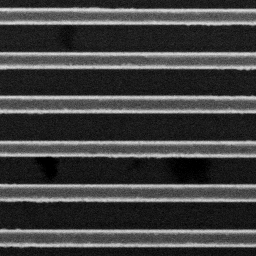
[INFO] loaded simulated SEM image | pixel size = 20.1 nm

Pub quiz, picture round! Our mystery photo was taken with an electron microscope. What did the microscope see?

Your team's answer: lines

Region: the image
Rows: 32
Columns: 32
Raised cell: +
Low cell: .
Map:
................................
++++++++++++++++++++++++++++++++
++++++++++++++++++++++++++++++++
................................
................................
................................
................................
++++++++++++++++++++++++++++++++
++.++..+++++++++++++++++++++++++
................................
................................
................................
++++++++++++++++++++++++++++++++
++++++++++++++++++++++++++++++++
................................
................................
................................
................................
++++++++++++++++++++++++++++++++
++++++++++++++++++++++++++++++++
................................
................................
................................
++++++++++++++++++++++++++++++++
++++++++++++++++++++++++++++++++
................................
................................
................................
................................
++++++++++++++++++++++++++++++++
++++++++++++++++++++++++++++++++
................................